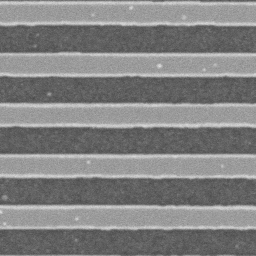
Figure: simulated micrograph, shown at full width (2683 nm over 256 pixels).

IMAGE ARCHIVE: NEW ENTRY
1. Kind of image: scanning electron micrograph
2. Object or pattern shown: lines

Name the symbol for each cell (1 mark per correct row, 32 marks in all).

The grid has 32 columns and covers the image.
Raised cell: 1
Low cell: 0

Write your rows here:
11111111111111111111111111111111
11111111111111111111111111111111
11111111111111111111111111111111
00000000000000000000000000000000
00000000000000000000000000000000
00000000000000000000000000000000
00000000000000000000000000000000
11111111111111111111111111111111
11111111111111111111111111111111
00000000000000000000010000000000
00000000000000000000000000000000
00000000000000000000000000000000
00000000000000000000000000000000
11111111111111111111111111111111
11111111111111111111111111111111
11111111111111111111111111111111
00000000000000000000000000000000
00000000000000000000000000000000
00000000000000000000000000000000
11111111111111111111111111111111
11111111111111111111111111111111
11111111111111111111111111111111
00000000000000000000000000000000
00000000000000000000000000000000
00000000000000000000000000000000
00000000000000000000000000000000
11111111111111111111111111111111
11111111111111111111111111111111
10001110000111111111111111110111
00000000000000000000000000000000
00000000000000000000000000000000
00000000000000000000000000000000